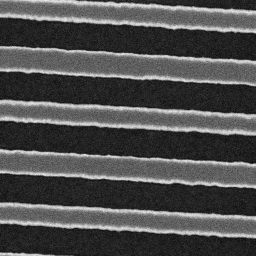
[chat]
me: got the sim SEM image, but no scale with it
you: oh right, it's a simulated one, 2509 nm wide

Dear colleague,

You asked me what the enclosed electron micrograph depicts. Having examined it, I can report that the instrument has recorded lines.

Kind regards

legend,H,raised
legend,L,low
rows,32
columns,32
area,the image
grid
HHHHHHHHHHHHHHHHLLLLLLLLLLLLLLLL
HHHHHHHHHHHHHHHHHHHHHHHHHHHHHHHH
LLLLLHHHHHHHHHHHHHHHHHHHHHHHHHHH
LLLLLLLLLLLLLLLLLLLLLHHHHHHHHHHH
LLLLLLLLLLLLLLLLLLLLLLLLLLLLLLLL
LLLLLLLLLLLLLLLLLLLLLLLLLLLLLLLL
HHHHHHHHHHHHHHLLLLLLLLLLLLLLLLLL
HHHHHHHHHHHHHHHHHHHHHHHHHHHHHHLL
HHHHHHHHHHHHHHHHHHHHHHHHHHHHHHHH
LLLLLLLLLLLHHHHHHHHHHHHHHHHHHHHH
LLLLLLLLLLLLLLLLLLLLLLLLLLLLLLHH
LLLLLLLLLLLLLLLLLLLLLLLLLLLLLLLL
LLLLLLLLLLLLLLLLLLLLLLLLLLLLLLLL
HHHHHHHHHHHHHHHHHHHLLLLLLLLLLLLL
HHHHHHHHHHHHHHHHHHHHHHHHHHHHHHHH
LLLLLLLHHHHHHHHHHHHHHHHHHHHHHHHH
LLLLLLLLLLLLLLLLLLLLLLLLLHHHHHHH
LLLLLLLLLLLLLLLLLLLLLLLLLLLLLLLL
LLLLLLLLLLLLLLLLLLLLLLLLLLLLLLLL
HHHHHHHHHHHHHHLLLLLLLLLLLLLLLLLL
HHHHHHHHHHHHHHHHHHHHHHHHHHHHHHHL
HHHHHHHHHHHHHHHHHHHHHHHHHHHHHHHH
LLLLLLLLLLLLLLLLHHHHHHHHHHHHHHHH
LLLLLLLLLLLLLLLLLLLLLLLLLLLLLLLH
LLLLLLLLLLLLLLLLLLLLLLLLLLLLLLLL
HHHHLLLLLLLLLLLLLLLLLLLLLLLLLLLL
HHHHHHHHHHHHHHHHHHHHHLLLLLLLLLLL
HHHHHHHHHHHHHHHHHHHHHHHHHHHHHHHH
LLLLLLLLHHHHHHHHHHHHHHHHHHHHHHHH
LLLLLLLLLLLLLLLLLLLLLLLLLLLHHHHH
LLLLLLLLLLLLLLLLLLLLLLLLLLLLLLLL
LLLLLLLLLLLLLLLLLLLLLLLLLLLLLLLL